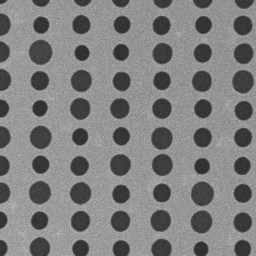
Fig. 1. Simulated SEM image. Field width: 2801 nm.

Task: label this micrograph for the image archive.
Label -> a regular array of holes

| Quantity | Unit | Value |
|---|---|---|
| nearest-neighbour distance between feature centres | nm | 302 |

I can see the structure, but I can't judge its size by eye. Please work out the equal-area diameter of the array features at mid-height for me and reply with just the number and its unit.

204 nm